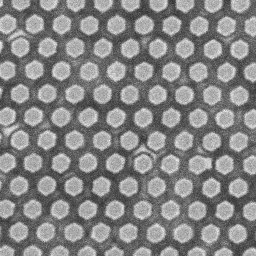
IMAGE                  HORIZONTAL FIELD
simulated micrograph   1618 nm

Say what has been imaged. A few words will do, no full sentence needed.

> a regular array of raised bodies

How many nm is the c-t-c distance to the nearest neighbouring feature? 167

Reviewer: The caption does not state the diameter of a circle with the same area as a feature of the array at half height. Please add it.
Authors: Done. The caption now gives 111 nm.